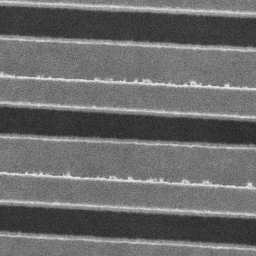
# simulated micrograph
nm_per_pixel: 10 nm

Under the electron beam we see lines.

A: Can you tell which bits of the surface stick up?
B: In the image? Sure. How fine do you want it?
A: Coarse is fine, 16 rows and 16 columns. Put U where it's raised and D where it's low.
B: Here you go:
DDDDDDDDUUUUUUUU
DDDDDDDDDDDDDDDD
UUDDDDDDDDDDDDDD
UUUUUUUUUUUUUUUU
UUUUUUUUUUUUUUUU
UUUUUUUUUUUUUUUU
UUUUUUUUUUUUUUUU
DDDDDDDDDDDDDDDD
DDDDDDDDDDDDDDDD
UUUUUUUUUUUUUUUU
UUUUUUUUUUUUUUUU
UUUUUUUUUUUUUUUU
UUUUUUUUUUUUUUUU
DDDDDDDDDDDDDDDD
DDDDDDDDDDDDDDDD
UUUUUUUUUUUUUUUD